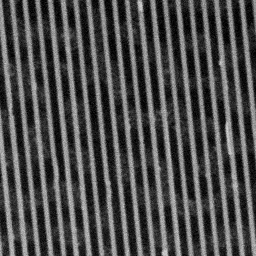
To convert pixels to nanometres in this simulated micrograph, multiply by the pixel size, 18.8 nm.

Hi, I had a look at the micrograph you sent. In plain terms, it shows parallel lines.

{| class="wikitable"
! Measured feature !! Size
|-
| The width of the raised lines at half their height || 74.7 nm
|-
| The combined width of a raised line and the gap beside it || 0.238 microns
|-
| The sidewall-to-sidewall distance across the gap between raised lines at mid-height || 0.166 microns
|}